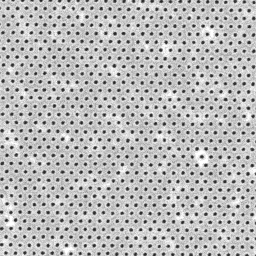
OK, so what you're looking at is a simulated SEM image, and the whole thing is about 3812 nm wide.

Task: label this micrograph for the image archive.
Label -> a regular array of holes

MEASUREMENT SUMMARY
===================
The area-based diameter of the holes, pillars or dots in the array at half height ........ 0.0629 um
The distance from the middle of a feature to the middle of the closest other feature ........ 0.132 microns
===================